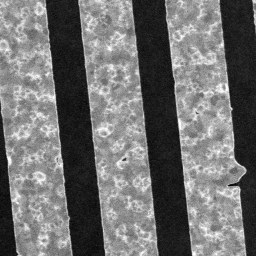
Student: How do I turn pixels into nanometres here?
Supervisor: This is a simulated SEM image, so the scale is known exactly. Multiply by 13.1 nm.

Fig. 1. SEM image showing one or a few lines or trenches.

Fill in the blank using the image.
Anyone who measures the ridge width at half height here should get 691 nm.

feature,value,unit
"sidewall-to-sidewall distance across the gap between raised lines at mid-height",0.443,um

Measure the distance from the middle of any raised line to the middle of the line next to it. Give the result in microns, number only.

1.14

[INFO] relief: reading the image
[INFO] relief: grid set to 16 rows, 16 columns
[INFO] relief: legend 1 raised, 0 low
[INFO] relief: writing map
1110011100111100
1110011100111100
1110011100011100
1110011110011100
1110011110011100
1110011110011100
1110001110011100
1111001110011100
1111001110011110
1111001110011110
0111001110011110
0111001110001110
0111001111001110
0111001111001110
0111001111001110
0111000111001110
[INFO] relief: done